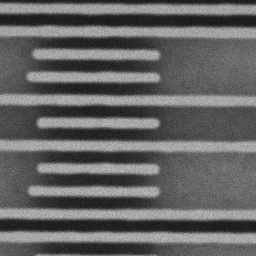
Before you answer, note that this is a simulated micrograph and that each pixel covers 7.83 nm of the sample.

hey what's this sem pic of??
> groups of lines, slits or small figures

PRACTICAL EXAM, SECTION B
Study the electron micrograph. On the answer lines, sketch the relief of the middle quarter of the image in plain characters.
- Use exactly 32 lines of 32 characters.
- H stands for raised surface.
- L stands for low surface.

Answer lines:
LLLLLLLLLLLLLLLLLLLLLLLLLLLLLLLL
LLLLLLLLLLLLLLLLLLLLLLLLLLLLLLLL
HHHHHHHHHHHHHHHHHHHHHHHLLLLLLLLL
HHHHHHHHHHHHHHHHHHHHHHHHLLLLLLLL
LLLLLLLLLLLLLLHLLLLLLLLLLLLLLLLL
LLLLLLLLLLLLLLLLLLLLLLLLLLLLLLLL
LLLLLLLLLLLLLLLLLLLLLLLLLLLLLLLL
LLLLLLLLLLLLLLLLLLLLLLLLLLLLLLLL
HHHHHHHHHHHHHHHHHHHHHHHHHHHHHHHH
HHHHHHHHHHHHHHHHHHHHHHHHHHHHHHHH
LLLLLLLLLLLLLLLLLLLLLLLLLLLLLLLL
LLLLLLLLLLLLLLLLLLLLLLLLLLLLLLLL
LLLLLLLLLLLLLLLLLLLLLLLLLLLLLLLL
LLLLLLLLLLLLLLLLLLLLLLLLLLLLLLLL
HHHHHHHHHHHHHHHHHHHHHHHHLLLLLLLL
HHHHHHHHHHHHHHHHHHHHHHHLLLLLLLLL
LLLLLLLLLLLLLLLLLLLLLLLLLLLLLLLL
LLLLLLLLLLLLLLLLLLLLLLLLLLLLLLLL
LLLLLLLLLLLLLLLLLLLLLLLLLLLLLLLL
HHHHHHHHHHHHHHHLLLLLLLLLLLLLLLLL
HHHHHHHHHHHHHHHHHHHHHHHHHHHHHHHH
HHHHHHHHHHHHHHHHHHHHHHHHHHHHHHHH
LLLLLLLLLLLLLLLLLLLLLLLLLLLLLLLL
LLLLLLLLLLLLLLLLLLLLLLLLLLLLLLLL
LLLLLLLLLLLLLLLLLLLLLLLLLLLLLLLL
HHHHHHHHHHHHHHHHHHHHHHHLLLLLLLLL
HHHHHHHHHHHHHHHHHHHHHHHHLLLLLLLL
LLLLLLLLLLLLLLLLLLLLLLLLLLLLLLLL
LLLLLLLLLLLLLLLLLLLLLLLLLLLLLLLL
LLLLLLLLLLLLLLLLLLLLLLLLLLLLLLLL
LLLLLLLLLLLLLLLLLLLLLLLLLLLLLLLL
HHHHHHHHHHHHHHHHHHHHHHHHLLLLLLLL